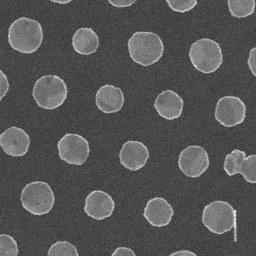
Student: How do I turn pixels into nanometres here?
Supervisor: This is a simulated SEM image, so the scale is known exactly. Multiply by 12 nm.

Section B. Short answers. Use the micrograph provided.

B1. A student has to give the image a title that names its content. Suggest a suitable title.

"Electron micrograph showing a regular array of raised bodies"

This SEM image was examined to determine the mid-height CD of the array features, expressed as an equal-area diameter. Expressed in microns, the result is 0.365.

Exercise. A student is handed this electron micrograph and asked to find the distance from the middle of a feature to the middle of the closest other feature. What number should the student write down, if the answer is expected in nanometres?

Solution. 726